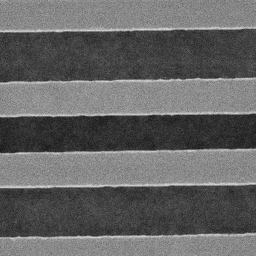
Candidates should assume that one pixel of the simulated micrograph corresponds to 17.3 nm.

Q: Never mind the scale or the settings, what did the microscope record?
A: lines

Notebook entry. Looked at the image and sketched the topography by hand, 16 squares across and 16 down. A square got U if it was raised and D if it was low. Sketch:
UUUUUUUUUUUUUUUU
UUUUUUUUUUUUUUUU
DDDDDDDDDDDDDDDD
DDDDDDDDDDDDDDDD
DDDDDDDDDDDDDDDD
UUUUUUUUUUUUUUUU
UUUUUUUUUUUUUUUU
DDDDDDDDDDDDDDDD
DDDDDDDDDDDDDDDD
DDDDDDDUUUUUUUUU
UUUUUUUUUUUUUUUU
UUUUUUUUUUUUUUUU
DDDDDDDDDDDDDDDD
DDDDDDDDDDDDDDDD
DDDDDDDDDDDDDDDD
UUUUUUUUUUUUUUUU